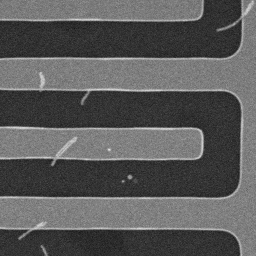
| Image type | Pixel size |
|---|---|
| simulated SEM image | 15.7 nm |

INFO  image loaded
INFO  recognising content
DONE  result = groups of lines, slits or small figures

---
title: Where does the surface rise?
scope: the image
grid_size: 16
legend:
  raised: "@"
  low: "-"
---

@@@@@@@@@@@@@--@
---------------@
---------------@
--------------@@
@@@@@@@@@@@@@@@@
@@@@@@@@@@@@@@@@
---------------@
---------------@
@@@@@@@@@@@@@--@
@@@@@@@@@@@@@--@
---------------@
---------------@
@@@@@@@@@@@@@@@@
@@@@@@@@@@@@@@@@
--------------@@
---------------@